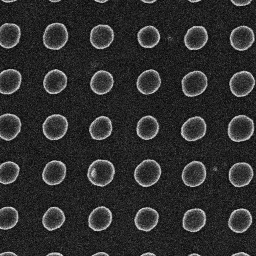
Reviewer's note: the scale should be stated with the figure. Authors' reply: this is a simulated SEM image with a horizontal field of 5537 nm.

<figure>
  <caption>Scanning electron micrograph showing a regular array of raised bodies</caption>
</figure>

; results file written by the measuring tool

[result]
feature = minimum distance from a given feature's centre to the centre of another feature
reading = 980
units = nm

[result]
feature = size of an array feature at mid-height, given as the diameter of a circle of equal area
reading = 23.4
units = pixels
